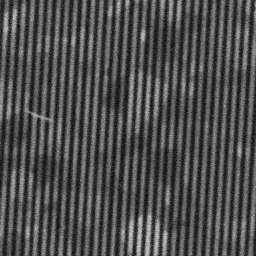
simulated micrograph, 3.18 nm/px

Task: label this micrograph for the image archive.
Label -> parallel lines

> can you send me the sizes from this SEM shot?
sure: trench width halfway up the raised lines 5.13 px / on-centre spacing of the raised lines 0.0274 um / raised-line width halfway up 10.7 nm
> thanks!